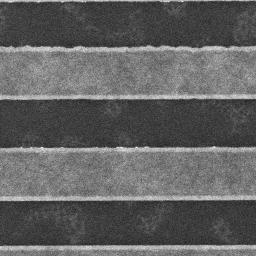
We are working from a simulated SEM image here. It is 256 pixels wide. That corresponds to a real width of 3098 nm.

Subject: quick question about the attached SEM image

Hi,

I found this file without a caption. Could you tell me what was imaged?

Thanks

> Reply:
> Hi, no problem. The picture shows one or a few lines or trenches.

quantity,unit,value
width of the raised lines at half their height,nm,595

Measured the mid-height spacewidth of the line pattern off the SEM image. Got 584 nanometers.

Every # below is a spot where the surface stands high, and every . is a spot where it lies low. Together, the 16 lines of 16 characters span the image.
................
................
................
################
################
################
................
................
................
################
################
################
................
................
................
################